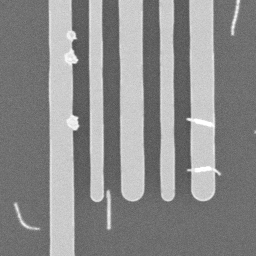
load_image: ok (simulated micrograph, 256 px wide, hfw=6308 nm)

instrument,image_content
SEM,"groups of lines, slits or small figures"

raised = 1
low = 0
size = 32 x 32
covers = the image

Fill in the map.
00000011100110011100110011100000
00000011100110011100110011100000
00000011100110011100110011100000
00000011100110011100110011100000
00000011100110011100110011100000
00000011100110011100110011100000
00000011100110011100110011100000
00000011110110011100110011100000
00000011100110011100110011100000
00000011100110011100110011100000
00000011100110011100110011100000
00000011100110011100110011100000
00000011100110011100110011100000
00000011100110011100110011100000
00000011100110011100110011100000
00000011110110011100110011100000
00000011100110011100110011100000
00000011100110011100110011100000
00000011100110011100110011100000
00000011100110011100110011100000
00000011100110011100110011100000
00000011100110011100110011100000
00000011100110011100110011100000
00000011100110011100110011100000
00000011100110011100110011000000
00000011100000000000000000000000
00000011100000000000000000000000
00000011100000000000000000000000
00000011100000000000000000000000
00000011100000000000000000000000
00000011100000000000000000000000
00000011100000000000000000000000